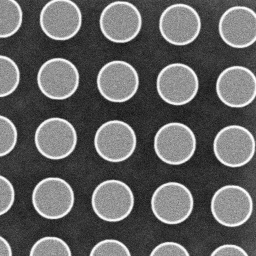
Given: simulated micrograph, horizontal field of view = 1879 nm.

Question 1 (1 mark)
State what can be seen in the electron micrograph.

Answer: an array of small figures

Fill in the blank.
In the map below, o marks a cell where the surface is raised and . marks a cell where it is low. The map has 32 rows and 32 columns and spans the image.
oo....ooo.....oo................
ooo..ooooo...oooo...oooo....oooo
ooo..ooooo...ooooo..ooooo...oooo
oo...ooooo...ooooo..ooooo..ooooo
o.....ooo....oooo...ooooo...oooo
......................o......oo.
................................
o.....oo........................
oo...oooo....oooo....ooo.....oo.
oo...ooooo..ooooo...ooooo...oooo
oo...ooooo..ooooo...ooooo..ooooo
o....oooo...ooooo...ooooo..ooooo
..............oo.....ooo....oooo
................................
................................
oo...oooo....ooo.....oo.........
oo..ooooo...ooooo...oooo...oooo.
oo..oooooo..ooooo..ooooo...ooooo
oo...oooo...ooooo..ooooo...ooooo
......oo.....ooo....oooo...oooo.
.....................o......ooo.
................................
o....ooo........................
oo..ooooo...oooo....ooo.....oo..
oo..ooooo...ooooo..ooooo...oooo.
oo..ooooo...ooooo..ooooo..ooooo.
o....oooo...oooo...ooooo...oooo.
.............oo.....ooo....oooo.
................................
................................
o...oooo....ooo.....oo..........
o...ooooo..ooooo...oooo....oooo.